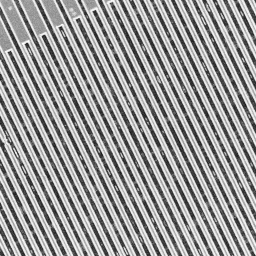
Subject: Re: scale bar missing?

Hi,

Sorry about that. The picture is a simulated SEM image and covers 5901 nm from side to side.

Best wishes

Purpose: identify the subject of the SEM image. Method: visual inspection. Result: parallel lines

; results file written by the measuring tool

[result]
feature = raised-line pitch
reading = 217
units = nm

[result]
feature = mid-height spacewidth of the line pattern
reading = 0.138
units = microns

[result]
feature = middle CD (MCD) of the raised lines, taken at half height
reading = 91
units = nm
